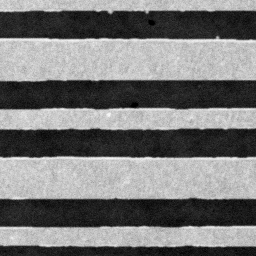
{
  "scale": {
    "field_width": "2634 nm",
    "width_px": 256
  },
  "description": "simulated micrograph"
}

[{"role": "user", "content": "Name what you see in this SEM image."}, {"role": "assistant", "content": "lines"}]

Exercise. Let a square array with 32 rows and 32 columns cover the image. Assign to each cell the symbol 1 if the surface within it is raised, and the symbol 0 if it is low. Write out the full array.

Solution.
11111111111111111111111111111111
00000000000000000000000000000000
00000000000000000000000000000000
00000000000000000000000000000000
00000000000000000000000000000000
11111111111111111111111111111111
11111111111111111111111111111111
11111111111111111111111111111111
11111111111111111111111111111111
11111111111111111111111111111111
00000000000000000000000000000000
00000000000000000000000000000000
00000000000000000000000000000000
00000000000000000000000000000000
11111111111111111111111111111111
11111111111111111111111111111111
00000000000000000000000000000000
00000000000000000000000000000000
00000000000000000000000000000000
00000000000000000000000000000000
11111111111111111111111111111111
11111111111111111111111111111111
11111111111111111111111111111111
11111111111111111111111111111111
11111111111111111111111111111111
00000000000000000000000000000000
00000000000000000000000000000000
00000000000000000000000000000000
00000000000001000110000101111111
11111111111111111111111111111111
11111111111111111111111111111111
00000000000000000000000000000000